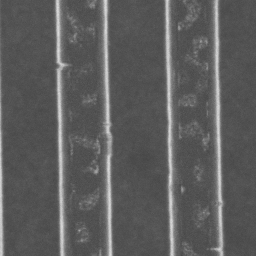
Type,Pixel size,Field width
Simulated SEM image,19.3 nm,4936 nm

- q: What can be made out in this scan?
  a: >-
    one or a few lines or trenches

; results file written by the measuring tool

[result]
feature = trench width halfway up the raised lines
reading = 918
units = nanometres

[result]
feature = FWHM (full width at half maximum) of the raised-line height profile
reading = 1.2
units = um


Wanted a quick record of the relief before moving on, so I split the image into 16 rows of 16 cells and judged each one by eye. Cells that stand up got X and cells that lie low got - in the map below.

XXXX---XXX----XX
XXXX---XXX----XX
XXXX---XXXX---XX
XXXX---XXXX---XX
XXXX---XXXX---XX
XXXX---XXXX---XX
XXXX---XXXX---XX
XXXX---XXXX---XX
XXXX---XXXX---XX
XXXX---XXXX---XX
XXXX---XXXX---XX
XXXX---XXXX---XX
XXXX---XXXX---XX
XXXX---XXXX---XX
XXXX---XXXX---XX
XXXX---XXXX---XX